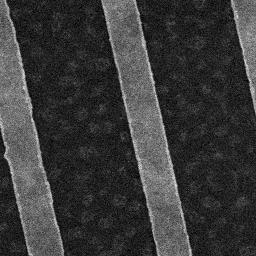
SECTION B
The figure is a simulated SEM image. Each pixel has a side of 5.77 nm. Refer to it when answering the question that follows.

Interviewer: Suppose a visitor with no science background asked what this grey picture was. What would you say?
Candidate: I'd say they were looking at one or a few lines or trenches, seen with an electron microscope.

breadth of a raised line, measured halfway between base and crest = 185 nm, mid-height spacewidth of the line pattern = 0.537 um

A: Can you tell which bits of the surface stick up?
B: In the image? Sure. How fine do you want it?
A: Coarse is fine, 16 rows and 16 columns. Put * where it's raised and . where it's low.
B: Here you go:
......***......*
*......**......*
*......**......*
*......**......*
*......**......*
**......**......
**......**......
**......**......
**......**......
**......***.....
.**......**.....
.**......**.....
.**......**.....
.**......**.....
..**......**....
..**......**....